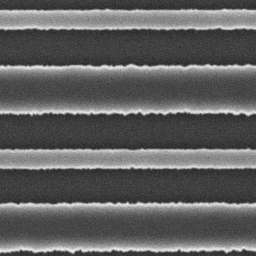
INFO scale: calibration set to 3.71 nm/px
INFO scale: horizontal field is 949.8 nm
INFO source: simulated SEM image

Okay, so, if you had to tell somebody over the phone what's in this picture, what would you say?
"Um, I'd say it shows lines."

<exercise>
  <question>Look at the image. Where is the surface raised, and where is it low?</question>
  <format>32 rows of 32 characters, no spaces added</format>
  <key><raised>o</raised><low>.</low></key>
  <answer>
................................
oooooooooooooooooooooooooooooooo
oooooooooooooooooooooooooooooooo
oooooooooooooooooooooooooooooooo
................................
................................
................................
................................
oooooooooooooooooooooooooooooooo
oooooooooooooooooooooooooooooooo
oooooooooooooooooooooooooooooooo
oooooooooooooooooooooooooooooooo
oooooooooooooooooooooooooooooooo
oooooooooooooooooooooooooooooooo
................................
................................
................................
................................
................................
oooooooooooooooooooooooooooooooo
oooooooooooooooooooooooooooooooo
................................
................................
................................
................................
oooooooooooooooooooooooooooooooo
oooooooooooooooooooooooooooooooo
oooooooooooooooooooooooooooooooo
oooooooooooooooooooooooooooooooo
oooooooooooooooooooooooooooooooo
oooooooooooooooooooooooooooooooo
o...o...........................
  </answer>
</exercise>